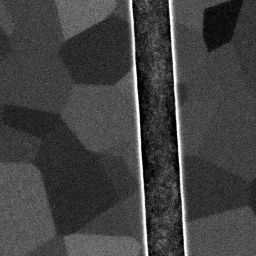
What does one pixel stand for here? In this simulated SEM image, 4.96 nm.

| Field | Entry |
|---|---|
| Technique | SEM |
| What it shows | one or a few lines or trenches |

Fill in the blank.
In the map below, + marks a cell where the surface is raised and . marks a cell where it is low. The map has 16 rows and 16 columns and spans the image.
++++++++...+++++
++++++++...+++++
++++++++...+++++
++++++++...+++++
++++++++...+++++
+++++++++..+++++
+++++++++..+++++
+++++++++..+++++
+++++++++..+++++
+++++++++..+++++
+++++++++..+++++
+++++++++..+++++
+++++++++..+++++
+++++++++..+++++
+++++++++...++++
+++++++++...++++